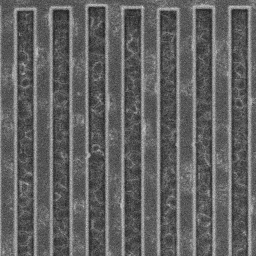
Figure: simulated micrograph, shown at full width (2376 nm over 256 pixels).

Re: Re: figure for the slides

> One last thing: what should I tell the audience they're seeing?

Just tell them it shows parallel lines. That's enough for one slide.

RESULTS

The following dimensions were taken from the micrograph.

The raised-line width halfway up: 160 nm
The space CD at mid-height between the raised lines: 168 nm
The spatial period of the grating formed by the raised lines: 331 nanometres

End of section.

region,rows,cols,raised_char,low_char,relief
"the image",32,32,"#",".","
################################
##..###..##..###..##..##...##..#
##..##...##..##...##..##...##..#
##..##...##..##...##..##...##..#
##..##...##..##...##..##...##..#
##..##...##..##...##..##...##..#
##..##...##..##...##..##...##..#
##..##...##..##...##..##...##..#
##..##...##..##...##..##...##..#
##..##...##..##...##..##...##..#
##..##...##..##...##..##...##..#
##..##...##..##...##..##...##..#
##..##...##..##...##..##...##..#
##..##...##..##...##..##...##..#
##..##...##..##...##..##...##..#
##..##...##..##...##..##...##..#
##..##...##..##...##..##...##..#
##..##...##..##...##..##...##..#
##..##...##..##...##..##...##..#
##..##...##..##...##..##...##..#
##..##...##..##...##..##...##..#
##..##...##..##...##..##...##..#
##..##...##..##...##..##...##..#
##..##...##..##...##..##...##..#
##..##...##..##...##..##...##..#
##..##...##..##...##..##...##..#
##..##...##..##...##..##...##..#
##..##...##..##...##..##...##..#
##..##...##..##...##..##...##..#
##..##...##..##...##..##...##..#
##..##...##..##...##..##...##..#
##..##...##..##...##..##...##..#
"